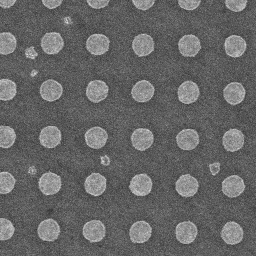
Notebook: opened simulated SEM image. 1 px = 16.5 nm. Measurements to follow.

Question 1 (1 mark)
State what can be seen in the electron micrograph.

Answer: a regular array of raised bodies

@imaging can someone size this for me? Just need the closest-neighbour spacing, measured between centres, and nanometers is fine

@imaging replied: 753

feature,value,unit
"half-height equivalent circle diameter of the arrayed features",360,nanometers